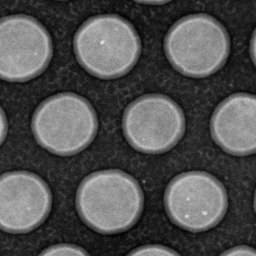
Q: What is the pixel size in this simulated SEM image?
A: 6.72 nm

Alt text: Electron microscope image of raised bodies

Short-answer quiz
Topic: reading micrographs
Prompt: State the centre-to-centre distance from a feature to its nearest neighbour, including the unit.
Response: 594 nm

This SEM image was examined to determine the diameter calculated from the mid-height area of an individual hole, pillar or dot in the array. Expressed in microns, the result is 0.4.